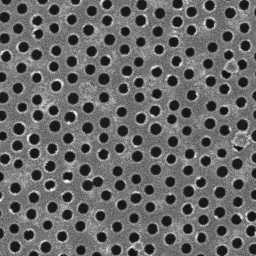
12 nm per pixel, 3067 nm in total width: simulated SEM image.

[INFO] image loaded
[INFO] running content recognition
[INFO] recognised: a regular array of holes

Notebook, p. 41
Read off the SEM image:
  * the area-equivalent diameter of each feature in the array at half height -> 125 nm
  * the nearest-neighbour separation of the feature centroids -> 206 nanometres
